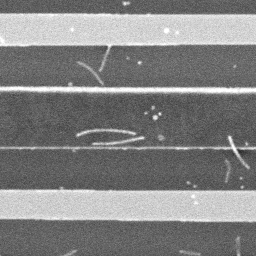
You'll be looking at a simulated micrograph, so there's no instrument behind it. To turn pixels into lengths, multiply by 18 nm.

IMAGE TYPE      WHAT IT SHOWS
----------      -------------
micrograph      lines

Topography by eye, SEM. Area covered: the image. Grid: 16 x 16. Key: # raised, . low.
................
################
################
................
................
##..............
################
################
################
................
................
................
################
################
................
................